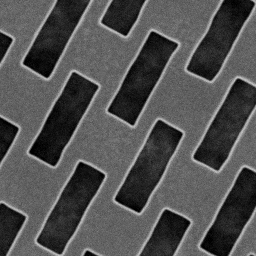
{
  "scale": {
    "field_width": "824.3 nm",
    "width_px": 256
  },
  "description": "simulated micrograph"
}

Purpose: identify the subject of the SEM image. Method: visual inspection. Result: groups of lines, slits or small figures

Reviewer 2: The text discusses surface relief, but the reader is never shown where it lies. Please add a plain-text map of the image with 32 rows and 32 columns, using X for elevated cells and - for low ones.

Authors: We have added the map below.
XXXXXXX----XXX----XXXXXXXXXX----
XXXXXX-----XX-----XXXXXXXXX----X
XXXXXX----XXX----XXXXXXXXXX----X
XXXXX----XXXXX--XXXXXXXXXX----XX
-XXXX----XXXXXXXXXX-XXXXXX----XX
-XXX----XXXXXXXXXX----XXX----XXX
-XX-----XXXXXXXXX-----XX-----XXX
XXX----XXXXXXXXXX----XXX----XXXX
XXXX---XXXXXXXXX-----XX-----XXXX
XXXXX-XXX-XXXXXX----XXXXX--XXXXX
XXXXXXXX----XXX-----XXXXXXXXX--X
XXXXXXXX----XXX----XXXXXXXXXX---
XXXXXXX----XXX----XXXXXXXXXX----
XXXXXXX----XXX----XXXXXXXXX-----
XXXXXX----XXXX---XXXXXXXXXX----X
--XXXX----XXXXXX-XX--XXXXX-----X
--XXX----XXXXXXXXXX----XXX----XX
--XX-----XXXXXXXXX-----XX-----XX
-XXX----XXXXXXXXXX----XXX----XXX
-XXX----XXXXXXXXX-----XX-----XXX
XXXXXX-XXX-XXXXXX----XXXX---XXXX
XXXXXXXXX----XXX-----XXXXXXXXX--
XXXXXXXXX----XXX----XXXXXXXXX---
XXXXXXXX----XXX----XXXXXXXXXX---
XXXXXXX-----XXX----XXXXXXXXX----
XXXXXXX----XXXX---XXXXXXXXXX----
--XXXX-----XXXXXXXXX--XXXXX-----
---XXX----XXXXXXXXXX---XXXX----X
---XX-----XXXXXXXXX-----XX----XX
--XXX----XXXXXXXXXX----XXX----XX
--XXX---XXXXXXXXXX----XXX----XXX
-XXXXXX-XXXXXXXXXX----XXXX---XXX